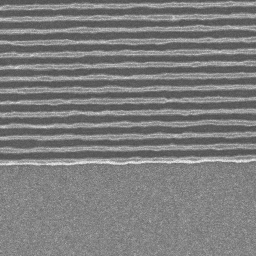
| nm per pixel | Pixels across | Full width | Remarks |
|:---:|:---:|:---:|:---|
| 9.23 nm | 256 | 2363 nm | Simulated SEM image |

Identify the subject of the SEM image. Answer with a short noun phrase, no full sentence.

parallel lines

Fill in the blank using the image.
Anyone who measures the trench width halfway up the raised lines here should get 7.76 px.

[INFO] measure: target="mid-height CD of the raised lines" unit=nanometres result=36.9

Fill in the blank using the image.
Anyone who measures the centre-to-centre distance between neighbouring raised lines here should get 11.9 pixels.